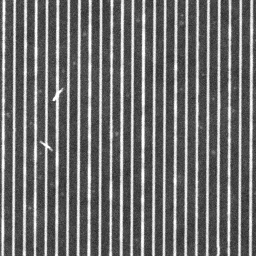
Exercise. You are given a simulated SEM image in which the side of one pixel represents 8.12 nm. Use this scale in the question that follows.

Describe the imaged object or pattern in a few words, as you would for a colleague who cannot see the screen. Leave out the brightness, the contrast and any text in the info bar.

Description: parallel lines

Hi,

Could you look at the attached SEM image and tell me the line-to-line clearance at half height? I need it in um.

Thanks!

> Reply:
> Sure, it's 0.0711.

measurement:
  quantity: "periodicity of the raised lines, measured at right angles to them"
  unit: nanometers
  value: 87.5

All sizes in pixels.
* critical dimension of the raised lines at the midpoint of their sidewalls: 1.63